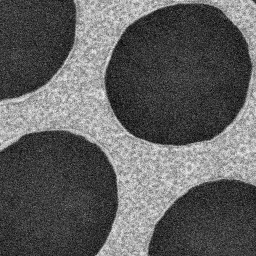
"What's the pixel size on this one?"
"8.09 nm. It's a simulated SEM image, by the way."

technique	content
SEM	holes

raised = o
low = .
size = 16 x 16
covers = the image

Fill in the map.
.....ooooo....oo
.....ooo.......o
.....oo........o
....ooo.........
....ooo.........
...oooo.........
ooooooo........o
ooooooo........o
o....ooo......oo
.......ooooooooo
.......ooooooooo
.......oooooo...
.......oooo.....
.......ooo......
.......ooo......
......ooo.......